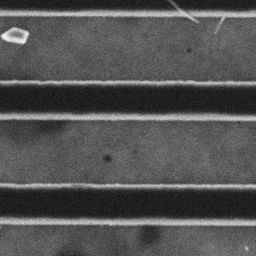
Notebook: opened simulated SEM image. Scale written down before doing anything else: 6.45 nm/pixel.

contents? lines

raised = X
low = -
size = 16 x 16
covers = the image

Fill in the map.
XXXXXXXXXXXXXXXX
----------------
----------------
----------------
----------------
XXXXXXXXXXXXXXXX
XXXXXXXXXXXXXXXX
----------------
----------------
----------------
----------------
----------------
XXXXXXXXXXXXXXXX
XXXXXXXXXXXXXXXX
----------------
----------------